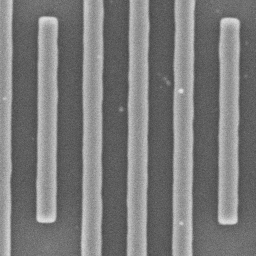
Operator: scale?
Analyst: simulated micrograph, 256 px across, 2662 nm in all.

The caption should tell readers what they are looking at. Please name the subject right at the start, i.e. groups of lines, slits or small figures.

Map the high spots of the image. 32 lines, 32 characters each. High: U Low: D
UUDDDDDDDDDUUDDDUUDDDDUUDDDDDDDD
UUDDDDDDDDDUUDDDUUDDDDUUDDDDDDDD
UDDDDUUDDDDUUDDDUUUDDDUUDDDDUUDD
UDDDDUUDDDDUUDDDUUUDDDUUDDDDUUDD
UDDDDUUDDDUUUDDDUUUDDDUUDDDDUUDD
UDDDDUUDDDUUUDDDUUDDDDUUDDDUUUDD
UUDDDUUDDDUUUDDDUUDDDDUUDDDUUUDD
UDDDDUUDDDUUUDDDUUDDDDUUDDDUUUDD
UDDDDUUDDDUUUDDDUUDDDDUUDDDDUUDD
UDDDDUUDDDUUUDDDUUDDDDUUDDDDUUDD
UDDDDUUDDDUUUDDDUUDDDDUUDDDDUUDD
UDDDDUUDDDUUUDDDUUDDDDUUDDDDUUDD
UDDDDUUDDDUUUDDDUUDDDDUUDDDDUUDD
UDDDDUUDDDUUUDDDUUDDDDUUDDDDUUDD
UDDDDUUDDDUUUDDDUUDDDDUUDDDDUUDD
UDDDDUUDDDUUUDDDUUDDDDUUDDDUUUDD
UDDDDUUDDDUUUDDDUUDDDDUUDDDUUUDD
UDDDDUUDDDUUUDDDUUDDDDUUDDDUUUDD
UDDDDUUDDDUUUDDDUUDDDDUUDDDUUUDD
UDDDDUUDDDUUUDDDUUDDDDUUDDDUUUDD
UDDDDUUDDDUUUDDDUUDDDDUUDDDUUUDD
UDDDDUUDDDUUUDDDUUDDDDUUDDDUUUDD
UDDDDUUDDDUUUDDDUUDDDDUUDDDUUUDD
UDDDDUUDDDUUUDDDUUDDDDUUDDDUUUDD
UDDDDUUDDDUUUDDDUUDDDDUUDDDUUUDD
UDDDDUUDDDUUUDDDUUDDDDUUDDDUUUDD
UDDDDUUDDDUUUDDDUUDDDDUUDDDUUUDD
UDDDDUUDDDUUUDDDUUDDDDUUDDDUUUDD
UDDDDDDDDDUUUDDDUUDDDDUUDDDDDDDD
UDDDDDDDDDUUUDDDUUDDDDUUDDDDDDDD
UDDDDDDDDDUUUDDDUUDDDDUUDDDDDDDD
UDDDDDDDDDUUUDDDUUDDDDUUDDDDDDDD